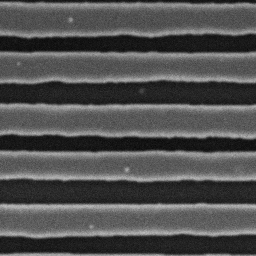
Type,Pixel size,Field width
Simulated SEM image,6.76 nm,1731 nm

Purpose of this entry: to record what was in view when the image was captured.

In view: lines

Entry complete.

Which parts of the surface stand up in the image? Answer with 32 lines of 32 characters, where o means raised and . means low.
oooooooooooooooooooooooo.....ooo
oooooooooooooooooooooooooooooooo
oooooooooooooooooooooooooooooooo
oooooooooooooooooooooooooooooooo
..ooooooooooo.....oo............
................................
................................
oooooooooooooooooooooooooooooooo
oooooooooooooooooooooooooooooooo
oooooooooooooooooooooooooooooooo
................................
................................
................................
oooooooooooooooooooooooooooooooo
oooooooooooooooooooooooooooooooo
oooooooooooooooooooooooooooooooo
oooooooooooooooooooooooooooooooo
................................
................................
oooooooooooooooooooooooooooooooo
oooooooooooooooooooooooooooooooo
oooooooooooooooooooooooooooooooo
.............oo.ooooooo...oooooo
................................
................................
........................o.......
oooooooooooooooooooooooooooooooo
oooooooooooooooooooooooooooooooo
oooooooooooooooooooooooooooooooo
...ooooo........................
................................
................................